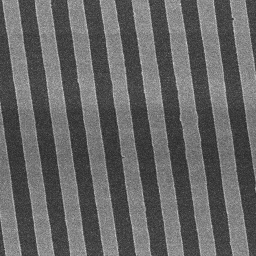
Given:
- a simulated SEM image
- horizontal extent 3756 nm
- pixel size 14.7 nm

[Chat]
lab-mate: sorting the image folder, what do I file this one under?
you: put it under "parallel lines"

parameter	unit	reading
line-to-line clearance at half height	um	0.245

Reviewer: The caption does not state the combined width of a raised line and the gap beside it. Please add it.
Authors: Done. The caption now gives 472 nm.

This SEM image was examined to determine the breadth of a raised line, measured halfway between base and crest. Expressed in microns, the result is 0.223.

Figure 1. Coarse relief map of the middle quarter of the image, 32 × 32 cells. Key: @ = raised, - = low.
---@@@@----@@@@----@@@@----@@@@-
---@@@@-----@@@-----@@@-----@@@-
---@@@@-----@@@-----@@@@----@@@@
----@@@-----@@@-----@@@@----@@@@
----@@@@----@@@@----@@@@----@@@@
----@@@@----@@@@----@@@@----@@@@
----@@@@----@@@@----@@@@-----@@@
----@@@@----@@@@----@@@@-----@@@
----@@@@----@@@@----@@@@-----@@@
----@@@@-----@@@-----@@@@----@@@
-----@@@-----@@@-----@@@@----@@@
-----@@@-----@@@-----@@@@----@@@
@----@@@@----@@@@----@@@@----@@@
@----@@@@----@@@@----@@@@----@@@
@----@@@@----@@@@----@@@@----@@@
@----@@@@-----@@@-----@@@-----@@
@----@@@@-----@@@-----@@@-----@@
@-----@@@-----@@@-----@@@@----@@
@-----@@@-----@@@-----@@@@----@@
@@----@@@@----@@@@----@@@@----@@
@@----@@@@----@@@@----@@@@----@@
@@----@@@@----@@@@----@@@@-----@
@@----@@@@----@@@@-----@@@-----@
@@----@@@@-----@@@-----@@@-----@
@@-----@@@-----@@@-----@@@@----@
@@-----@@@-----@@@@----@@@@----@
@@@----@@@@----@@@@----@@@@----@
@@@----@@@@----@@@@----@@@@----@
@@@----@@@@----@@@@----@@@@-----
@@@----@@@@----@@@@----@@@@-----
@@@----@@@@-----@@@-----@@@-----
@@@-----@@@-----@@@@----@@@@----